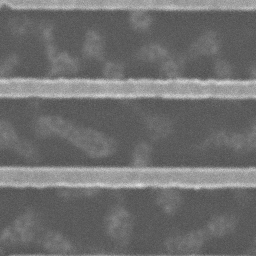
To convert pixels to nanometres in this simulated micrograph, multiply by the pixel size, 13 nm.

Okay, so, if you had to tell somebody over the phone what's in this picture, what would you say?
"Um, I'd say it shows one or a few lines or trenches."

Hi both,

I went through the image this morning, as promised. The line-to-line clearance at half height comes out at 942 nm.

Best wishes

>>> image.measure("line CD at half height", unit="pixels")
15.9